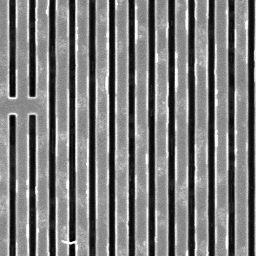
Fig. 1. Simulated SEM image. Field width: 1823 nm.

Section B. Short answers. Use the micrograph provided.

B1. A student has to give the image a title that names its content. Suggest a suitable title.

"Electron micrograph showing parallel lines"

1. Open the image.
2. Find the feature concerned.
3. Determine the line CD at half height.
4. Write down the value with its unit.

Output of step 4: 0.0979 um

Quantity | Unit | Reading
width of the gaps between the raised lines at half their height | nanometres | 41.8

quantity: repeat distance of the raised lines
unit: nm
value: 142